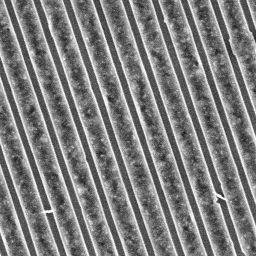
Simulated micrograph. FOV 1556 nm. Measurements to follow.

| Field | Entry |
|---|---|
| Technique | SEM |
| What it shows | parallel lines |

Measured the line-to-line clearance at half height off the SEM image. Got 7.71 px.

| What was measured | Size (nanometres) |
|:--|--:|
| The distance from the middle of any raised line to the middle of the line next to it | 170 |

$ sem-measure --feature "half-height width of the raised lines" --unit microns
0.124